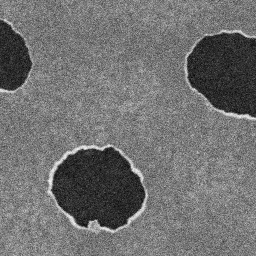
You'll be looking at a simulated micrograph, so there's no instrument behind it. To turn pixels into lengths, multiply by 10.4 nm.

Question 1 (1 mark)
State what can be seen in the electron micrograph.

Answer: holes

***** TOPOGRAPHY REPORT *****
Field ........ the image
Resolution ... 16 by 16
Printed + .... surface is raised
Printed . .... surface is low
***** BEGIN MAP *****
++++++++++++++++
++++++++++++++++
.++++++++++++...
..++++++++++....
..++++++++++....
.+++++++++++....
+++++++++++++...
++++++++++++++++
++++++++++++++++
+++++..+++++++++
+++.....++++++++
+++......+++++++
+++......+++++++
++++....++++++++
++++++++++++++++
++++++++++++++++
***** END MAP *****